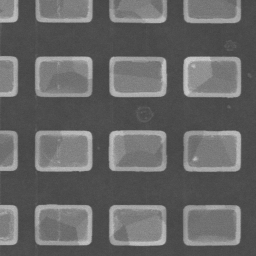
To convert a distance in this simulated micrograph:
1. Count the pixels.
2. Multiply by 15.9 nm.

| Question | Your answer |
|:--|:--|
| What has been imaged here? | wiring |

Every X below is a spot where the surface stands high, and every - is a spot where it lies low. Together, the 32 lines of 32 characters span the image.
XX---XXXXXX---XXXXXXX--XXXXXXX--
XX---XXXXXX---XXXXXXX--XXXXXXX--
XX---XXXXXX---XXXXXX----XXXXX---
--------------------------------
--------------------------------
--------------------------------
--------------------------------
XX---XXXXXX---XXXXXX----XXXXXX--
XX---XXXXXX---XXXXXX---XXXXXXX--
XX---XXXXXX---XXXXXX---XXXXXXX--
XX---XXXXXX---XXXXXX---XXXXXXX--
XX---XXXXXX---XXXXXX---XXXXXXX--
--------------------------------
--------------------------------
--------------------------------
--------------------------------
--------------------------------
XX---XXXXXX---XXXXXX---XXXXXXX--
XX---XXXXXX---XXXXXX---XXXXXXX--
XX---XXXXXX---XXXXXX---XXXXXXX--
XX---XXXXXX---XXXXXX---XXXXXXX--
--------------------------------
--------------------------------
--------------------------------
--------------------------------
--------------------------------
XX---XXXXXX---XXXXXX---XXXXXXX--
XX---XXXXXX---XXXXXX---XXXXXXX--
XX---XXXXXX---XXXXXX---XXXXXXX--
XX---XXXXXX---XXXXXX---XXXXXXX--
--------------------------------
--------------------------------